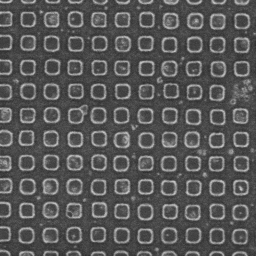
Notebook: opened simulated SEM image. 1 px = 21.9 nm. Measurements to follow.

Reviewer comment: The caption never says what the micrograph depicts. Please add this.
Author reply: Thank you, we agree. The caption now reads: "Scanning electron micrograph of a regular array of raised bodies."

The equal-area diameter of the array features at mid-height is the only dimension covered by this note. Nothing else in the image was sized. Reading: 0.334 µm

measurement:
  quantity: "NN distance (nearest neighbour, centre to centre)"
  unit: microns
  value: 0.507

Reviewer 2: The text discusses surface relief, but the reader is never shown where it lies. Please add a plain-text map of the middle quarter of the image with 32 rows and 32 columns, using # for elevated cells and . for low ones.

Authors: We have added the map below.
.###...###...###...###...###...#
.###...###...###...###...###...#
..##....##....##...###...###...#
................................
................................
.###...###...###...###...###....
.####..###...###...###...###...#
.####..###...###...###...###...#
..##....##...........#.........#
................................
................................
..##...###...###...###...###....
.####..###...###...###...###...#
.####..###...###...###...###...#
..##...............###...###...#
................................
................................
.###...###...###...###...###...#
.####..###...###...###...###...#
.####..###...###...###...###...#
..##.........###...###.........#
................................
................................
.###...###...###...###...###...#
.###...###...###...###...###...#
.###...###...###...###...###...#
.............##....###...##....#
................................
................................
.###...###...###...###...###...#
.###...###...###...###...###...#
.###...###...###...###...###...#